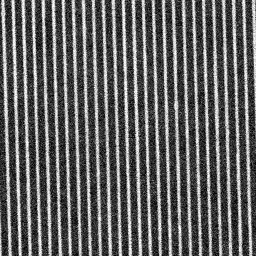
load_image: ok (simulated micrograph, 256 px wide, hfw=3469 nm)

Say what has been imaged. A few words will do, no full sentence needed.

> parallel lines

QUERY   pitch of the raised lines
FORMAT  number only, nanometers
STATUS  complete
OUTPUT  136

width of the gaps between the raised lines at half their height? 7.87 pixels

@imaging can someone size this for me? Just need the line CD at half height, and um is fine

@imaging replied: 0.0254